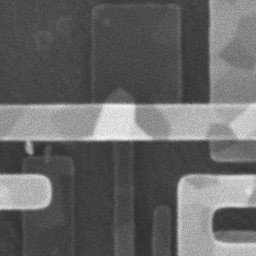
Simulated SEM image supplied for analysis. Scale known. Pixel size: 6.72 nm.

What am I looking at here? wiring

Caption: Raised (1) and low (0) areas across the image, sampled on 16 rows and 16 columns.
0000000000000000
0000000000000000
0000000000000000
0000000000000000
0000000000000000
0000000000000000
0000000000000000
1111111111111111
1111111111111111
0000000000000000
0000000000000000
1110000000011111
1110000000011111
0000000000011000
0000000000011000
0000000000011111